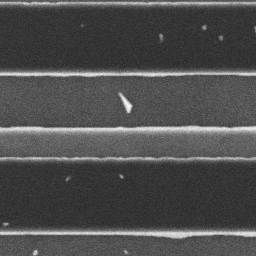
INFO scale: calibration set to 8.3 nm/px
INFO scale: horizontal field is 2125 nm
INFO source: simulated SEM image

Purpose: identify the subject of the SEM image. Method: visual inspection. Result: lines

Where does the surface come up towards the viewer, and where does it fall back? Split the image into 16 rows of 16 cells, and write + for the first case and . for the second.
++++++++++++++++
++++++++++++++++
++++++++++++++++
++++++++++++++++
++++++++++++++++
................
................
................
++++++++++++++++
++++++++++++++++
++++++++++++++++
++++++++++++++++
++++++++++++++++
++++++++++++++++
++++++++++++++++
................